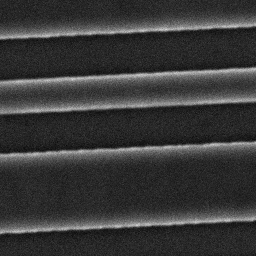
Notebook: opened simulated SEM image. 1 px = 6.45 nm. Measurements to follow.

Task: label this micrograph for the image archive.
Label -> lines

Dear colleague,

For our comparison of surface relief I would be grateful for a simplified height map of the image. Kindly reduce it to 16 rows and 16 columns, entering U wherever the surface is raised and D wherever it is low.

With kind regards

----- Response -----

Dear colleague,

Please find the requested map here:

UUUUUUUUUUUUUUUU
UUUUUUUUUUUUUUUU
DDDDDDDDDDDDDDDD
DDDDDDDDDDDDDDDD
DDDDDDDDDDDDUUUU
UUUUUUUUUUUUUUUU
UUUUUUUUUUUDDDDD
DDDDDDDDDDDDDDDD
DDDDDDDDDDDDDDDD
DDDUUUUUUUUUUUUU
UUUUUUUUUUUUUUUU
UUUUUUUUUUUUUUUU
UUUUUUUUUUUUUUUU
UUUUUUUUUUUUUUUU
UUDDDDDDDDDDDDDD
DDDDDDDDDDDDDDDD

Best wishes